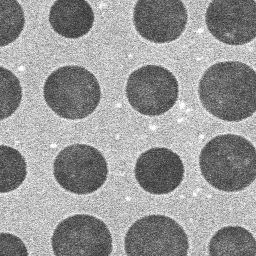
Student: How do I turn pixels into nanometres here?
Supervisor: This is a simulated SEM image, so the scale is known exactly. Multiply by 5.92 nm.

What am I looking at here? holes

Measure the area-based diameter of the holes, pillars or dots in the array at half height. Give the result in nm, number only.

311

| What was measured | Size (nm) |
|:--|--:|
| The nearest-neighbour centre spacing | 461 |